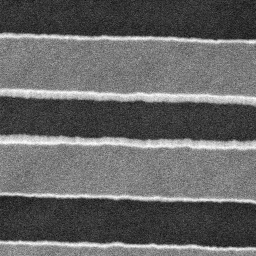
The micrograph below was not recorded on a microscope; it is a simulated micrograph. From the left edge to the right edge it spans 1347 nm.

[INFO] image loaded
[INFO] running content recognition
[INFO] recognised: lines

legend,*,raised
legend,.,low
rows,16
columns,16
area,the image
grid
................
................
*************...
****************
****************
****************
................
................
................
****************
****************
****************
............****
................
................
*************...